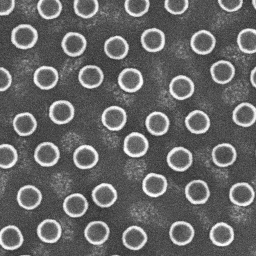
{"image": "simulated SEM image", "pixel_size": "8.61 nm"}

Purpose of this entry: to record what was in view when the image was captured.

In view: a regular array of raised bodies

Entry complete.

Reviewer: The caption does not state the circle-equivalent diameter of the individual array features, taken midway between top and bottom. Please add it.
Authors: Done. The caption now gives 22.2 px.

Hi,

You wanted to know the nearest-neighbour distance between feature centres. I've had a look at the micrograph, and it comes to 323 nm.